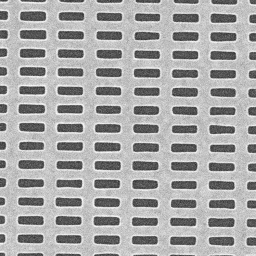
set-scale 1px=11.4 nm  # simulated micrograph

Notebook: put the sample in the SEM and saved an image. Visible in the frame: groups of lines, slits or small figures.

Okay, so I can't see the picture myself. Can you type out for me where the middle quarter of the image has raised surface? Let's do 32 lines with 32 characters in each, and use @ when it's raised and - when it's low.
@@@@@@@@@@@@@@@@@@@@@@@@@@@@@@@@
-----@@@------@@@@------@@@-----
-----@@@-------@@-------@@@-----
@@@@@@@@@@@@@@@@@@------@@@-----
@@@@@@@@@@@@@@@@@@@@@@@@@@@@@@@@
----@@@@@@@@@@@@@@@@@@@@@@@@@@@@
-----@@@------@@@-------@@@-----
-----@@@------@@@-------@@@-----
@@@@@@@@@@@@@@@@@@@@@@@@@@@@@@@@
@@@@@@@@@@@@@@@@@@@@@@@@@@@@@@@@
-----@@@------@@@@-----@@@@@----
-----@@@------@@@-------@@@-----
----@@@@@-----@@@@------@@@-----
@@@@@@@@@@@@@@@@@@@@@@@@@@@@@@@@
@@@@@@@@@@@@@@@@@@@@@@@@@@@@@@@@
-----@@@------@@@-------@@@-----
-----@@-------@@@-------@@@-----
@@@@@@@@@@@@@@@@@@-----@@@@@----
@@@@@@@@@@@@@@@@@@@@@@@@@@@@@@@@
----@@@@-----@@@@@--@@@@@@@@@@@@
-----@@-------@@@-------@@@-----
-----@@@------@@@-------@@@-----
@@@@@@@@@@@@@@@@@@@@@@@@@@@@@@@@
@@@@@@@@@@@@@@@@@@@@@@@@@@@@@@@@
-----@@@------@@@------@@@@-----
-----@@-------@@@-------@@@-----
----@@@@------@@@------@@@@-----
@@@@@@@@@@@@@@@@@@@@@@@@@@@@@@@@
@@@@@@@@@@@@@@@@@@@@@@@@@@@@@@@@
-----@@-------@@@------@@@@-----
-----@@-------@@@-------@@@-----
@@@@@@@@@@@@@@@@@@@@-@@@@@@@@@@@